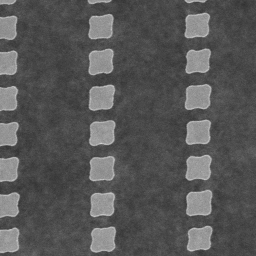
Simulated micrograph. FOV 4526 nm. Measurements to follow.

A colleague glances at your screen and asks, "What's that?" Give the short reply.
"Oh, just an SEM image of a regular array of raised bodies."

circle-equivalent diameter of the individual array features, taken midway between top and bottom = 455 nm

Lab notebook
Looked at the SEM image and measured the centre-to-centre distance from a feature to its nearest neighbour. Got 625 nm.